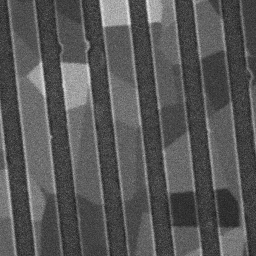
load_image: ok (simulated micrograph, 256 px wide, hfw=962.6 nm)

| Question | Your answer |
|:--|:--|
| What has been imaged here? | parallel lines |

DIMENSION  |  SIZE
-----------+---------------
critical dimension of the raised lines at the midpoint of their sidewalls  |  0.0996 um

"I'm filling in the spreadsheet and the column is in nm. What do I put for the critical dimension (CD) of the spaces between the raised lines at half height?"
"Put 74.7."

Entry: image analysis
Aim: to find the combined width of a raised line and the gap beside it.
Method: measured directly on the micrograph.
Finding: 174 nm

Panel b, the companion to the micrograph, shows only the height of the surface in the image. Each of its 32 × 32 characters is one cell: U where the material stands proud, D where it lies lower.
DUUUDDDUUUDDDUUUDDUUUUDDUUUUDDUU
DUUUDDDUUUDDDUUUDDDUUUDDUUUUDDUU
DUUUUDDUUUDDDUUUDDDUUUDDDUUUDDUU
DUUUUDDUUUDDDUUUDDDUUUDDDUUUDDUU
DUUUUDDUUUUDDUUUDDDUUUDDDUUUDDUU
DDUUUDDDUUUDDUUUDDDUUUDDDUUUDDDU
DDUUUDDDUUUDDUUUUDDUUUDDDUUUDDDU
DDUUUDDDUUUDDUUUUDDUUUDDDUUUDDDU
DDUUUDDDUUUDDDUUUDDUUUUDDUUUDDDU
DDUUUDDDUUUDDDUUUDDUUUUDDUUUUDDU
DDUUUDDDUUUDDDUUUDDDUUUDDUUUUDDU
DDUUUUDDUUUDDDUUUDDDUUUDDDUUUDDU
DDUUUUDDUUUDDDUUUDDDUUUDDDUUUDDU
DDUUUUDDUUUUDDUUUDDDUUUDDDUUUDDU
DDDUUUDDUUUUDDUUUDDDUUUDDDUUUDDD
DDDUUUDDDUUUDDUUUUDDUUUDDDUUUDDD
DDDUUUDDDUUUDDUUUUDDUUUDDDUUUDDD
DDDUUUDDDUUUDDUUUUDDUUUUDDUUUDDD
UDDUUUDDDUUUDDDUUUDDUUUUDDUUUDDD
UDDUUUDDDUUUDDDUUUDDUUUUDDUUUUDD
UDDUUUUDDUUUDDDUUUDDDUUUDDUUUUDD
UDDUUUUDDUUUDDDUUUDDDUUUDDDUUUDD
UDDUUUUDDUUUUDDUUUDDDUUUDDDUUUDD
UDDDUUUDDUUUUDDUUUDDDUUUDDDUUUDD
UDDDUUUDDDUUUDDUUUUDDUUUDDDUUUDD
UDDDUUUDDDUUUDDUUUUDDUUUDDDUUUDD
UDDDUUUDDDUUUDDDUUUDDUUUUDDUUUDD
UDDDUUUDDDUUUDDDUUUDDUUUUDDUUUDD
UUDDUUUDDDUUUDDDUUUDDDUUUDDUUUUD
UUDDUUUUDDUUUDDDUUUDDDUUUDDDUUUD
UUDDUUUUDDUUUDDDUUUDDDUUUDDDUUUD
UUDDUUUUDDUUUUDDUUUDDDUUUDDDUUUD